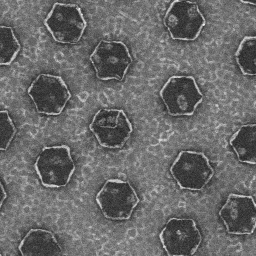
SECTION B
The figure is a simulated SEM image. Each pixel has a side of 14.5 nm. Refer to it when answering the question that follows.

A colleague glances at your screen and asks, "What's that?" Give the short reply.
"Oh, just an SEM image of a regular array of raised bodies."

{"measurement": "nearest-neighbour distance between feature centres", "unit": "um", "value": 1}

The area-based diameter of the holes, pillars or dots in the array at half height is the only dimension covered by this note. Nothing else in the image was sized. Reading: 564 nm